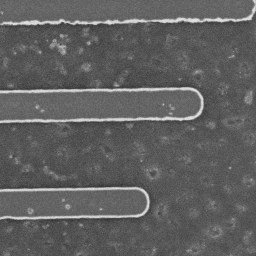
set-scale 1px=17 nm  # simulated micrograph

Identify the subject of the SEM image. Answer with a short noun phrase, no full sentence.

one or a few lines or trenches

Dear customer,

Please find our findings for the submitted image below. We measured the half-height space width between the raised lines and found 1180 nm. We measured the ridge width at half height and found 499 nm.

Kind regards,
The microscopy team